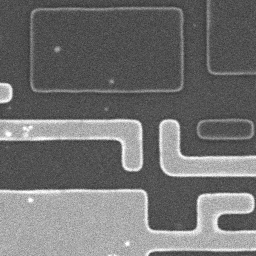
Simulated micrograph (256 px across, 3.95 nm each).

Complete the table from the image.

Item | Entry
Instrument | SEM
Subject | wiring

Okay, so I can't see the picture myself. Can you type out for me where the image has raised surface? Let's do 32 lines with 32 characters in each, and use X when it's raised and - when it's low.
--------------------------XXXXXX
----XXXXXXXXXXXXXXXXXXX---XXXXXX
----XXXXXXXXXXXXXXXXXXX---XXXXXX
----XXXXXXXXXXXXXXXXXXX---XXXXXX
----XXXXXXXXXXXXXXXXXXX---XXXXXX
----XXXXXXXXXXXXXXXXXXX---XXXXXX
----XXXXXXXXXXXXXXXXXXX---XXXXXX
----XXXXXXXXXXXXXXXXXXX---XXXXXX
----XXXXXXXXXXXXXXXXXXX---XXXXXX
----XXXXXXXXXXXXXXXXXXX---------
----XXXXXXXXXXXXXXXXXXX---------
X-------------------------------
X-------------------------------
--------------------------------
--------------------------------
XXXXXXXXXXXXXXXXX---XX---XXXXXX-
XXXXXXXXXXXXXXXXXX--XX---XXXXXXX
---------------XXX--XX----------
---------------XXX--XX----------
---------------XXX--XXX---------
---------------XXX--XXXXXXXXXXXX
---------------------XXXXXXXXXXX
--------------------------------
--------------------------------
XXXXXXXXXXXXXXXXXX-------XXXXXX-
XXXXXXXXXXXXXXXXXX-------XXXXXXX
XXXXXXXXXXXXXXXXXX-------XXXXXX-
XXXXXXXXXXXXXXXXXX-------XX-----
XXXXXXXXXXXXXXXXXXX------XX-----
XXXXXXXXXXXXXXXXXXXXXXXXXXXXXXXX
XXXXXXXXXXXXXXXXXXXXXXXXXXXXXXXX
XXXXXXXXXXXXXXXXXXX-------------